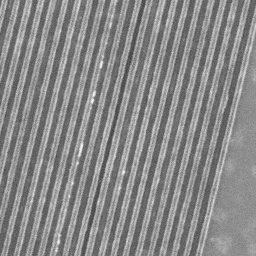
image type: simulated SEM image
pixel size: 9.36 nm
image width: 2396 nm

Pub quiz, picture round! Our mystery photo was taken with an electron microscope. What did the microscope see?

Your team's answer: parallel lines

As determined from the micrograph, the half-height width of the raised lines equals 46.6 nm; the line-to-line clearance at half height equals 7.05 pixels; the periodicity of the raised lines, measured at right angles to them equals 111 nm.